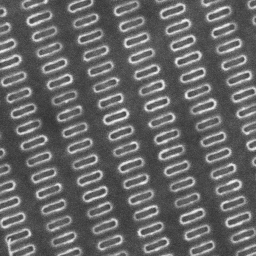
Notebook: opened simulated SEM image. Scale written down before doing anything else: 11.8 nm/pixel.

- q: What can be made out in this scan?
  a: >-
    a regular array of holes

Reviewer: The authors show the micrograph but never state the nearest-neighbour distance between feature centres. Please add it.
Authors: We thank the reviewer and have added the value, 196 nanometres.